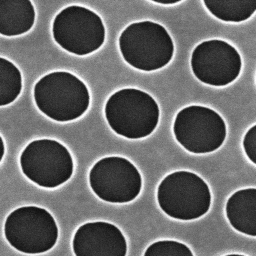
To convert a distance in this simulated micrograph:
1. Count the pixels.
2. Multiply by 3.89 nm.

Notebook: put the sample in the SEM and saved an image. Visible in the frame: a regular array of holes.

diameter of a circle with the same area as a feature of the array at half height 51.7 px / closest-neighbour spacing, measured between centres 267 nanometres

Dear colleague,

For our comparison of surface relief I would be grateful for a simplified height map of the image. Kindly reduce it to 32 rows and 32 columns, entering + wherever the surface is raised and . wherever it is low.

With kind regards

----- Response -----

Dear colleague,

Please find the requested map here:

....++++++++++++++++..+++.......
....+++.....++++++++++++++......
....+++......++++++++++++++....+
....+++......+++.....+++++++++++
+.+++++......++......+++++++++++
+++++++......++.......+++....+++
+++++++++...+++.......++......++
.+++++++++++++++.....+++......++
..+++++++++++++++...++++......++
...++....+++++++++++++++......++
...+.......+++++++++++++++...+++
...+.......+++....++++++++++++++
..++.......++......+++++++++++++
+++++......++.......+++...++++++
++++++....+++.......++......++++
++++++++++++++......++......++++
++++++++++++++.....+++......+++.
++++...+++++++++++++++......++..
.++.....+++++++++++++++....+++..
++.......++++++++++++++++++++++.
++.......+++.....+++++++++++++++
+++......++......+++++..++++++++
++++.....++.......++.....+++++++
++++++.++++.......++......+++++.
++++++++++++.....+++......+++...
++++++++++++++++++++......++....
+.....+++++++++++++++.....++....
+......++++++++++++++++.++++....
.......+++.....++++++++++++++...
+......++.......+++++++++++++++.
+......++.......+++....+++++++++
+++...+++.......++......++++++++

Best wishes